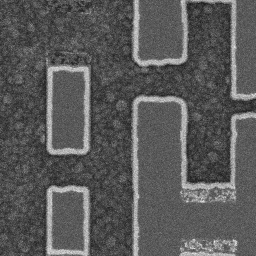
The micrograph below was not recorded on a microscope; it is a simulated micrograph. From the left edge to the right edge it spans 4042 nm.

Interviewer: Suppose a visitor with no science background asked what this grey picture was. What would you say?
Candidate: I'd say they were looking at one or a few lines or trenches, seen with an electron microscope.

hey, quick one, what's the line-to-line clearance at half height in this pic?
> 0.78 um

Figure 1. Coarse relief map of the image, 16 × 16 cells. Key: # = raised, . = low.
.........##....#
.........###...#
........####...#
.........##....#
...##..........#
...##..........#
...##....##.....
...##...####...#
...##...###....#
........####...#
........####...#
........####..##
...##....#######
...##....#######
...##....#######
...##....#######